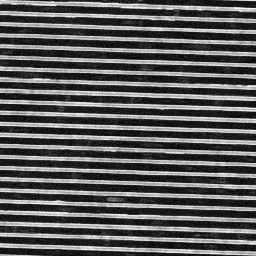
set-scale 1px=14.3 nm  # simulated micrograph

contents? parallel lines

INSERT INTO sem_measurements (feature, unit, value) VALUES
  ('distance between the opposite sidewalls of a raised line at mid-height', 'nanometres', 48.1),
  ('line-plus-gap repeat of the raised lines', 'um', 0.158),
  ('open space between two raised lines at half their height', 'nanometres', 111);